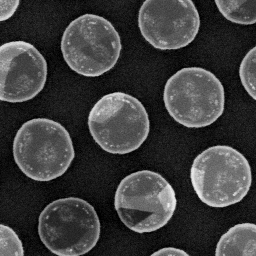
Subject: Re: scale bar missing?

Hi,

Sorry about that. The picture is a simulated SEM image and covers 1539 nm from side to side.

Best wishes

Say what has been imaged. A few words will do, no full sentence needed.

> raised bodies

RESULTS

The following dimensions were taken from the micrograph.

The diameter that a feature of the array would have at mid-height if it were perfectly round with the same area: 355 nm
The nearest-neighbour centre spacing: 483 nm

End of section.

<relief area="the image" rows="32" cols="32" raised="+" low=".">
++................++++++...+++++
++...............++++++++...++++
.........++++....++++++++....+++
........++++++....+++++++.......
........+++++++...++++++........
.++.....+++++++....++++.........
+++++...+++++++................+
+++++...+++++++................+
++++++...+++++................++
++++++................+++++...++
+++++................++++++...++
+++++................+++++++...+
.++..........++++....+++++++....
............++++++...+++++++....
...........+++++++....+++++.....
...++++....++++++++....+++......
..++++++...+++++++..............
..+++++++...++++++..............
..+++++++....++++..........++...
..+++++++................+++++..
..+++++++...............+++++++.
...+++++.........++.....+++++++.
................+++++...+++++++.
...............++++++...+++++++.
...............+++++++...+++++..
......+++++...++++++++....+++...
.....+++++++...+++++++..........
.....+++++++...++++++...........
+....+++++++....++++.........+++
++...+++++++................++++
+++...++++++...............+++++
+++....++++.........+++....+++++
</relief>